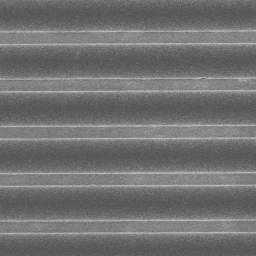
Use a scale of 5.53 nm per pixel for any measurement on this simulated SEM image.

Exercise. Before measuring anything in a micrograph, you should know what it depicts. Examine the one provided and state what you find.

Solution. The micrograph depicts parallel lines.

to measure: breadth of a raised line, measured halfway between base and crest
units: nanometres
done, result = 196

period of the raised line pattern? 261 nm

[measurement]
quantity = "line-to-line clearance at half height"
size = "0.0656 microns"